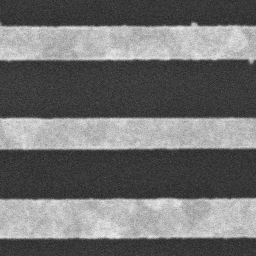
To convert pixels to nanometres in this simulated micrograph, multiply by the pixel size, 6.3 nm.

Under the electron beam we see lines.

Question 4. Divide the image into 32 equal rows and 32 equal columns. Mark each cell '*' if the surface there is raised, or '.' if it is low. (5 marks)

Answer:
................................
................................
................................
********************************
********************************
********************************
********************************
................................
................................
................................
................................
................................
................................
................................
................................
********************************
********************************
********************************
****************..*..*..........
................................
................................
................................
................................
................................
................................
********************************
********************************
********************************
********************************
********************************
................................
................................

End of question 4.